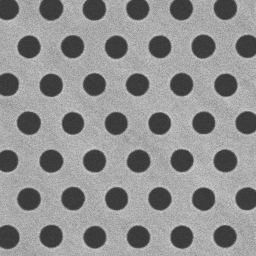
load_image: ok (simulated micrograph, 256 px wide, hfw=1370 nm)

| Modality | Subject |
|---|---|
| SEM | a regular array of holes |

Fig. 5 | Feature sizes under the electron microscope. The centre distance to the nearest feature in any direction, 43.3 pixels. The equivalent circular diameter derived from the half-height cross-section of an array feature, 124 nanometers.